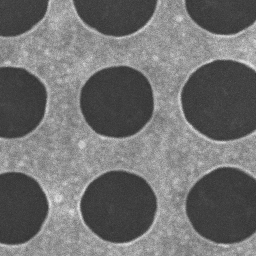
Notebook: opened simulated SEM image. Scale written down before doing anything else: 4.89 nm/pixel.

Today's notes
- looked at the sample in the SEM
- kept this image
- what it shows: holes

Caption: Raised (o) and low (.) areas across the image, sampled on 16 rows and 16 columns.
...oo.....oo....
..ooo....ooo....
oooooooooooooooo
oooooooooooooooo
..oooo...ooo....
...oo....oo.....
...oo.....o.....
...oo....ooo....
.ooooo..ooooo..o
oooooooooooooooo
oooooooooooooo.o
..oooo...ooo....
...oo.....oo....
...oo.....oo....
..oooo...ooo....
oooooooooooooooo